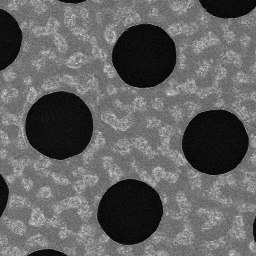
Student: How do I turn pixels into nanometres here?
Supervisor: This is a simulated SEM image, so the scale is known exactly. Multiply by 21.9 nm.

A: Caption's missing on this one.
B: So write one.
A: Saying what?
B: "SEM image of holes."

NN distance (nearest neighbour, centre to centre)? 2410 nanometers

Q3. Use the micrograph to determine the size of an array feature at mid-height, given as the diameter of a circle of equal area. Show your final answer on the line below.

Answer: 1440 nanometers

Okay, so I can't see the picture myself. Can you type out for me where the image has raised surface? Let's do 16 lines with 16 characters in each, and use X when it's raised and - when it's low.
XXXXXXXXXXXXX---
-XXXXXXXXXXXXXXX
-XXXXXX----XXXXX
-XXXXXX----XXXXX
XXXXXXX----XXXXX
XXXXXXXXXXXXXXXX
XX---XXXXXXXXXXX
XX----XXXXXX---X
XX----XXXXX----X
XX---XXXXXX----X
XXXXXXXXXXXX---X
XXXXXXX--XXXXXXX
XXXXXX----XXXXXX
XXXXXX----XXXXXX
XXXXXXX---XXXXXX
XXXXXXXXXXXXXXXX